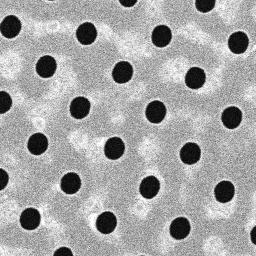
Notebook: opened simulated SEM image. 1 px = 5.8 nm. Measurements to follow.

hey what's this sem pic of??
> a regular array of holes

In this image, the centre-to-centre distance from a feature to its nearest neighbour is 52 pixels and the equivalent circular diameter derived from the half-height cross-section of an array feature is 129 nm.